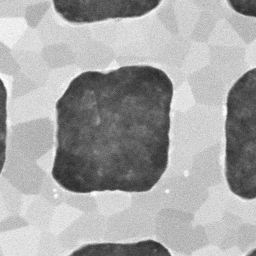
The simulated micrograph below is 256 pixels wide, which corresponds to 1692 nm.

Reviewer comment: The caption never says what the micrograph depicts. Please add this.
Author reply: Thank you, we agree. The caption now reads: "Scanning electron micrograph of holes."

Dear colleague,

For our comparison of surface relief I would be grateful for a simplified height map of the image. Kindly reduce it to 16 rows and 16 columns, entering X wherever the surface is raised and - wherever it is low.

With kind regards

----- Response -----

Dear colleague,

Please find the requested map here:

XXX-------XXXXX-
XXXXXXXXXXXXXXXX
XXXXXXXXXXXXXXXX
XXXXXXXXXXXXXXXX
XXXXXX----XXXXX-
XXXX-------XXX--
XXXX-------XXX--
XXXX-------XXX--
XXXX-------XXX--
XXX--------XXX--
XXX-------XXXX--
XXXX------XXXX--
XXXXXXXXXXXXXXXX
XXXXXXXXXXXXXXXX
XXXXXXXXXXXXXXXX
XXXXX-----XXXXXX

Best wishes